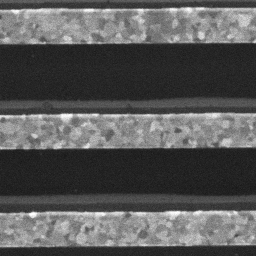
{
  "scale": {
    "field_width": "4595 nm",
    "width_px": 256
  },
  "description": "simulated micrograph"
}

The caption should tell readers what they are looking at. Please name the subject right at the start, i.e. lines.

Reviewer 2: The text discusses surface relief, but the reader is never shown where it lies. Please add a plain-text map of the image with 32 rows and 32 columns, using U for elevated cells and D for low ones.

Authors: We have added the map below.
UUUUUUUUUUUUUUUUUUUUUUUUUUUUUUUU
UUUUUUUUUUUUUUUUUUUUUUUUUUUUUUUU
UUUUUUUUUUUUUUUUUUUUUUUUUUUUUUUU
UUUUUUUUUUUUUUUUUUUUUUUUUUUUUUUU
UUUUUUUUUUUUUUUUUUUUUUUUUUUUUUUU
DDDDDDDDDDDDDDDDDDDDDDDDDDDDDDDD
DDDDDDDDDDDDDDDDDDDDDDDDDDDDDDDD
DDDDDDDDDDDDDDDDDDDDDDDDDDDDDDDD
DDDDDDDDDDDDDDDDDDDDDDDDDDDDDDDD
DDDDDDDDDDDDDDDDDDDDDDDDDDDDDDDD
DDDDDDDDDDDDDDDDDDDDDDDDDDDDDDDD
DDDDDDDDDDDDDDDDDDDDDDDDDDDDDDDD
DDDDDDDDDDDDDDDDDDDDDDDDDDDDDDDD
UUUUUUUUUUUUUUUUUUUUUUUUUUUUUUUU
UUUUUUUUUUUUUUUUUUUUUUUUUUUUUUUU
UUUUUUUUUUUUUUUUUUUUUUUUUUUUUUUU
UUUUUUUUUUUUUUUUUUUUUUUUUUUUUUUU
UUUUUUUUUUUUUUUUUUUUUUUUUUUUUUUU
UUUUUUUUDDDDDDDDDDDDDDDDDDDDDDDD
DDDDDDDDDDDDDDDDDDDDDDDDDDDDDDDD
DDDDDDDDDDDDDDDDDDDDDDDDDDDDDDDD
DDDDDDDDDDDDDDDDDDDDDDDDDDDDDDDD
DDDDDDDDDDDDDDDDDDDDDDDDDDDDDDDD
DDDDDDDDDDDDDDDDDDDDDDDDDDDDDDDD
DDDDDDDDDDDDDDDDDDDDDDDDDDDDDDDD
UUUUUUUUUUUUUUUUUUUUUUUUUUUUUUUU
UUUUUUUUUUUUUUUUUUUUUUUUUUUUUUUU
UUUUUUUUUUUUUUUUUUUUUUUUUUUUUUUU
UUUUUUUUUUUUUUUUUUUUUUUUUUUUUUUU
UUUUUUUUUUUUUUUUUUUUUUUUUUUUUUUU
UUUUUUUUUUUUUUUUUUUUUUUUUUUUUUUU
DDDDDDDDDDDDDDDDDDDDDDDDDDDDDDDD